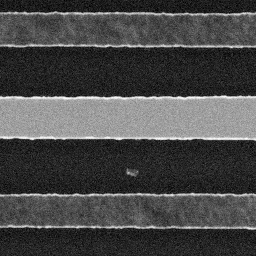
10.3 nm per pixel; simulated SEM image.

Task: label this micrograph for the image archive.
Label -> lines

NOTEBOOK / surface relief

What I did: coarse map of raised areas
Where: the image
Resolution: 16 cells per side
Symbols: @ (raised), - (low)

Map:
----------------
@@@@@@@@@@@@@@@@
@@@@@@@@@@@@@@@@
----------------
----------------
----------------
@@@@@@@@@@@@@@@@
@@@@@@@@@@@@@@@@
@@@@@@@@@@@@@@@@
----------------
----------------
----------------
@@@@@@@@@@@@@@@@
@@@@@@@@@@@@@@@@
----------------
----------------